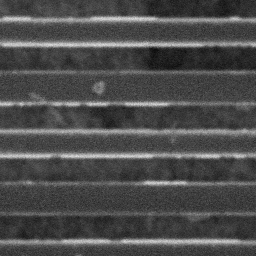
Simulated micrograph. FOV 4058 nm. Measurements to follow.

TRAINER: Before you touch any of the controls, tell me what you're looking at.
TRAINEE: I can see lines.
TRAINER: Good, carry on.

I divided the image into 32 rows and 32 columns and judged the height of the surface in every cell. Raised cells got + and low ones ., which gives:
................................
................................
...............+................
++++++++++++++++++++++++++++++++
++++++++++++++++++++++++++++++++
....+++..+++.+++++++++++++++++++
................................
................................
................................
++++++++++++++++++++++++++++++++
++++++++++++++++++++++++++++++++
++++++++++++++++++++++++++++++++
++++++++++++++++++++++++++++++++
................................
................................
................................
++++++++++++++++++++++++++++++++
++++++++++++++++++++++++++++++++
++++++++++++++++++++++++++++++++
................................
................................
................................
................................
++++++++++++++++++++++++++++++++
++++++++++++++++++++++++++++++++
++++++++++++++++++++++++++++++++
++++++++++++++++++++++++++++++++
................................
................................
................................
++++++++++++++++++++++++++++++++
++++++++++++++++++++++++++++++++